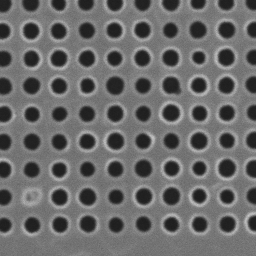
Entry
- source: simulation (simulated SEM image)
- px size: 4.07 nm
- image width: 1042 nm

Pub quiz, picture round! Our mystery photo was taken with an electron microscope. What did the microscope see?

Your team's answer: a regular array of holes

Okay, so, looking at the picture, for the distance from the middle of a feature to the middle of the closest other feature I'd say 112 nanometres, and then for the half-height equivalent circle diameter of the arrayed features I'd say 65.4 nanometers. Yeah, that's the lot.